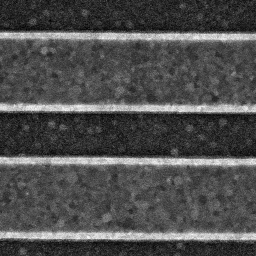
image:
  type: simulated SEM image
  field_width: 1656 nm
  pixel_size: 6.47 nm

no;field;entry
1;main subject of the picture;one or a few lines or trenches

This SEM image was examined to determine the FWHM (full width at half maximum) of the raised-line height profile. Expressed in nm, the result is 481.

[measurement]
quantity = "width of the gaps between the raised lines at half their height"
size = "336 nanometers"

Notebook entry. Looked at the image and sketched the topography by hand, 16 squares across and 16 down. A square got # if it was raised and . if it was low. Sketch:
................
................
################
################
################
################
################
................
................
................
################
################
################
################
################
................